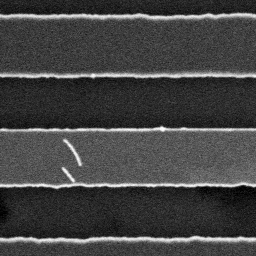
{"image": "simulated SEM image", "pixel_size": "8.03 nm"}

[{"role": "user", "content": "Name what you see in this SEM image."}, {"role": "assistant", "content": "lines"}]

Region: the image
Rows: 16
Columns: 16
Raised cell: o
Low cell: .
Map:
................
oooooooooooooooo
oooooooooooooooo
oooooooooooooooo
oooooooooooooooo
................
................
................
oooooooooooooooo
oooooooooooooooo
oooooooooooooooo
oooooooooooooooo
................
................
................
oooooooooooooooo